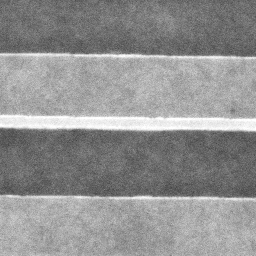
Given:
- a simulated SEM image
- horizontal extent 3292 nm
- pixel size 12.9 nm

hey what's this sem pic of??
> lines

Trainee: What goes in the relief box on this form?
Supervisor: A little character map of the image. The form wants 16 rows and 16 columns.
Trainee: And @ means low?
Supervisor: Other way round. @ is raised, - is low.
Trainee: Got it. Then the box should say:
----------------
----------------
----------------
@@@@@@----------
@@@@@@@@@@@@@@@@
@@@@@@@@@@@@@@@@
@@@@@@@@@@@@@@@@
@@@@@@@@@@@@@@@@
----------------
----------------
----------------
----------------
@@@@@@@@@@@@@@@@
@@@@@@@@@@@@@@@@
@@@@@@@@@@@@@@@@
@@@@@@@@@@@@@@@@